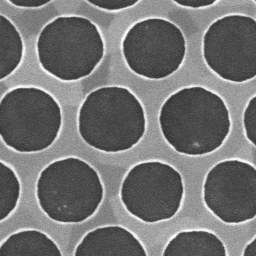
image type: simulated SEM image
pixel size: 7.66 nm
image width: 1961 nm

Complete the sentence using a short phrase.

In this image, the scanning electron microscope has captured holes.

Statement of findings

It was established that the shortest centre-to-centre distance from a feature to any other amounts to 633 nanometres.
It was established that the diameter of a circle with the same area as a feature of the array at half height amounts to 503 nanometres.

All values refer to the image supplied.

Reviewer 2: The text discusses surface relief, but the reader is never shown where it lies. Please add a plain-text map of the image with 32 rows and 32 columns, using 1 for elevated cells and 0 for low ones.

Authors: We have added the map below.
11000011111000000111110000011111
11111111111111111111111111111111
01111110000111111100011111100000
00111000000011110000001111000000
00011000000001110000000111000000
00011000000001100000000110000000
00011000000001100000000110000000
00011000000001110000000111000000
00111000000011110000001111000000
01111110000111111100011111100000
11111111111111111111111111111111
10000011111100001111110000011111
00000001111000000111100000001110
00000001110000000011000000001110
00000000110000000011000000000100
00000000110000000011000000000100
00000001110000000011000000000110
00000001110000000011100000001110
10000011111100001111110000011111
11111111111111111111111111111111
01111100000111111000011111100001
00111000000011110000001111000000
00111000000001100000000111000000
00011000000001100000000110000000
00111000000001100000000110000000
00111000000011100000000111000000
00111100000011110000001111000000
11111110000111111000011111110001
11111111111100011111111111111111
10000011111000000111110000011111
00000001110000000011100000001110
00000000100000000011000000001100